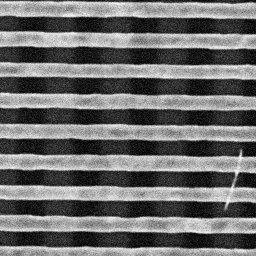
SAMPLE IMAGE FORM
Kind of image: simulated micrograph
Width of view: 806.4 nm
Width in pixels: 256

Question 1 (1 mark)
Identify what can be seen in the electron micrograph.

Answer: wiring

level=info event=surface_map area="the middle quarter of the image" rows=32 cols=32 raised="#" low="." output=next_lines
##################.#######......
################################
################################
................................
................................
................................
................................
................................
################################
#####.##########################
################################
................................
................................
................................
................................
#####.##########................
################################
################################
....############################
................................
................................
................................
................................
################################
################################
################################
...............#################
................................
................................
................................
................................
################################